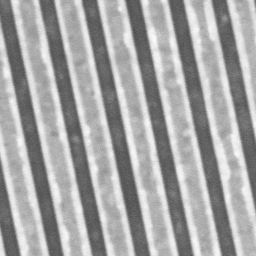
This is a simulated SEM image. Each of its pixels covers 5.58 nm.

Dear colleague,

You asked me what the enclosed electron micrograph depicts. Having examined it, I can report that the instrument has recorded parallel lines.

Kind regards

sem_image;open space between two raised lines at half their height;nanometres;105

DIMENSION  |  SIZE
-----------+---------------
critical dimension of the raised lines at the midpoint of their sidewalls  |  0.127 um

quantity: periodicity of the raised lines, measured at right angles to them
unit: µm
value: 0.236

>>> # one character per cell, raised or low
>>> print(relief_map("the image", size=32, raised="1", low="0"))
00111001110001100011100111000111
00111001110001110011100011000111
00111000110001110011100011100111
00111000111001110001100011100111
00011100111001110001110011100011
00011100111000110001110011100011
10011100111000111001110001100011
10011100011000111001110001110011
10011100011100111000111001110001
10001100011100111000111001110001
10001110011100011100111001110001
11001110011100011100111000110001
11001110001110011100111000111001
11000110001110011100011000111001
11000111001110011100011100111000
11000111001110001110011100111000
11100111001110001110011100011100
11100111000111001110001100011100
11100111000111001110001110011100
11100011100111001110001110011100
11100011100111000111001110001100
01110011100011000111001110001110
01110011100011100111000110001110
01110001100011100111000111001110
01110001110011100011000111001110
00110001110011100011100111001110
00111001110001100011100111000111
00111001110001110011100011000111
00111000110001110011100011100111
00111000111001110001100011100111
00011100111001110001110011100011
00011100111000110001110011100011